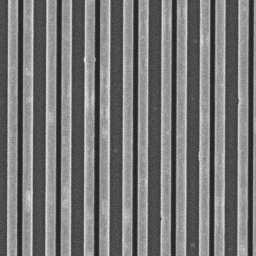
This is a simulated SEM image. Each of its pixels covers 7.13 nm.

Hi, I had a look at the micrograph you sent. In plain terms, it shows parallel lines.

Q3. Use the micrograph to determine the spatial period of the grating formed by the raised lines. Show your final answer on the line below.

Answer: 0.137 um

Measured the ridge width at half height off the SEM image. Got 0.0704 µm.